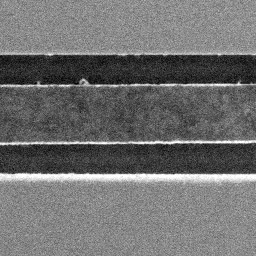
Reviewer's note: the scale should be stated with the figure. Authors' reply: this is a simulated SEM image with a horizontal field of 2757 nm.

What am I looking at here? lines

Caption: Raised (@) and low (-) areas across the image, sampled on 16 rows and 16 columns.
@@@@@@@@@@@@@@@@
@@@@@@@@@@@@@@@@
@@@@@@@@@@@@@@@@
----------------
----------------
@@@@@@@@@@@@@@@@
@@@@@@@@@@@@@@@@
@@@@@@@@@@@@@@@@
@@@@@@@@@@@@@@@@
----------------
----------------
@@@@@@@@@@@@@@@@
@@@@@@@@@@@@@@@@
@@@@@@@@@@@@@@@@
@@@@@@@@@@@@@@@@
@@@@@@@@@@@@@@@@